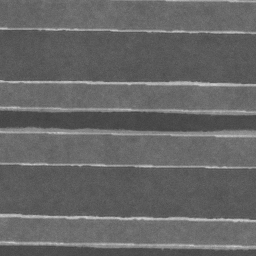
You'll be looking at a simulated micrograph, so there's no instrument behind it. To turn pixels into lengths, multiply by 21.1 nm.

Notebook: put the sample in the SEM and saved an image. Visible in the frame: lines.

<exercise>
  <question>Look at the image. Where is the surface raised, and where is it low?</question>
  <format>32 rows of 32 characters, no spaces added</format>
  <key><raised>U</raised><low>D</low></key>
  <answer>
UUUUUUUUUUUUUUUUUUUUUUUUUUUUUUUU
UUUUUUUUUUUUUUUUUUUUUUUUUUUUUUUU
UUUUUUUUUUUUUUUUUUUUUUUUUUUUUUUU
UUUUUUUUUUUUUUUUUUUUUUUUUUUUUUUU
DDDDDDDDDDDDDDDDDDDDDDDDDDDDDDDD
DDDDDDDDDDDDDDDDDDDDDDDDDDDDDDDD
DDDDDDDDDDDDDDDDDDDDDDDDDDDDDDDD
DDDDDDDDDDDDDDDDDDDDDDDDDDDDDDDD
DDDDDDDDDDDDDDDDDDDDDDDDDDDDDDDD
DDDDDDDDDDDDDDDDDDDDDDDDDDDDDDDD
UUUUUUUUUUUUUUUUUUUDDUUUDDDDDDDD
UUUUUUUUUUUUUUUUUUUUUUUUUUUUUUUU
UUUUUUUUUUUUUUUUUUUUUUUUUUUUUUUU
UUUUUUUUUUUUUUUUUUUUUUUUUUUUUUUU
DDDDDDDDDDDDDDDDDDDDDDDDDDDDDDDD
DDDDDDDDDDDDDDDDDDDDDDDDDDDDDDDD
UUUUUUUDDDDDDDDDDDDDDDDDDDDDDDDD
UUUUUUUUUUUUUUUUUUUUUUUUUUUUUUUU
UUUUUUUUUUUUUUUUUUUUUUUUUUUUUUUU
UUUUUUUUUUUUUUUUUUUUUUUUUUUUUUUU
DDDUUUUUUUUUUUUUUUUUUUUUUUUUUUUU
DDDDDDDDDDDDDDDDDDDDDDDDDDDDDDDD
DDDDDDDDDDDDDDDDDDDDDDDDDDDDDDDD
DDDDDDDDDDDDDDDDDDDDDDDDDDDDDDDD
DDDDDDDDDDDDDDDDDDDDDDDDDDDDDDDD
DDDDDDDDDDDDDDDDDDDDDDDDDDDDDDDD
DDDDDDDDDDDDDDDDDDDDDDDDDDDDDDDD
UUUUUUUUUUUUUUUUUUUUUUUUUUDDDDDD
UUUUUUUUUUUUUUUUUUUUUUUUUUUUUUUU
UUUUUUUUUUUUUUUUUUUUUUUUUUUUUUUU
DDDDDDDDDDDUUUUUUUUUUUUUUUUUUUUU
DDDDDDDDDDDDDDDDDDDDDDDDDDDDDDDD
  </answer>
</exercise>